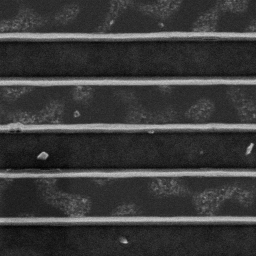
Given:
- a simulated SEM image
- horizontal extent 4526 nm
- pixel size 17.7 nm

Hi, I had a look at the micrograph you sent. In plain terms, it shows one or a few lines or trenches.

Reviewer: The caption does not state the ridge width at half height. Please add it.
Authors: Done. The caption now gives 0.8 micrometres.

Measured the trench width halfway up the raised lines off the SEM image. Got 831 nm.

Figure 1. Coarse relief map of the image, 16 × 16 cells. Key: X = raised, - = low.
XXXXXXXXXXXXXXXX
XXXXXXXXXXXXXXXX
----------------
----------------
----------------
XXXXXXXXXXXXXXXX
XXXXXXXXXXXXXXXX
XXXXXXXXXXXXXXXX
----------------
----------------
----------------
XXXXXXXXXXXXXXXX
XXXXXXXXXXXXXXXX
XXXXXXXXXXXXXXXX
----------------
----------------